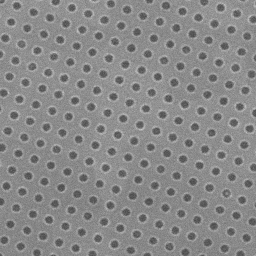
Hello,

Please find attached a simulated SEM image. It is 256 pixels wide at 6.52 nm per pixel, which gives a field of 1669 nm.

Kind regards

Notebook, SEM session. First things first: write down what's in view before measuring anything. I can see a regular array of holes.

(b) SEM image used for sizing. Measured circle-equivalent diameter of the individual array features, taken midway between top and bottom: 57 nm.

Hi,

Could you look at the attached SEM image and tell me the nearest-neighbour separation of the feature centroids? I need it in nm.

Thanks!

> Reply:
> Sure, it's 111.